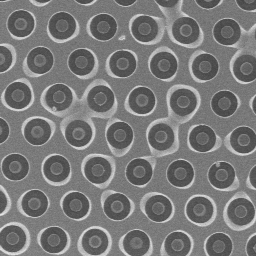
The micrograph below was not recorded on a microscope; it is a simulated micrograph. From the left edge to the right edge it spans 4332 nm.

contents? an array of small figures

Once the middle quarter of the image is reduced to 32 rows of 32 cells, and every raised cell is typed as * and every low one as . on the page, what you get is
*.......***.......***........**.
**......***.......***.......****
***....*****.....*****......****
***********************....*****
********************************
.******....******************.**
..****......*****.....*****.....
...**.......****......****......
...**........***.......***......
...**........**........***......
...*.........***.......***......
..***.......****......****......
***.***....*******...******.....
*.....*********************....*
......******...********....*****
.......****.....******......****
.......****......****.......****
........**.......****.......***.
.......****......****.......***.
*......****......****.......***.
**....*****......****.......***.
************....******.....*****
************************.*******
******.....*******..************
.****.......*****.....*****....*
.****.......****......****......
..***.......***.......****......
..***.......***.......****......
.*****......****......****......
*******....*****.....*****......
******************..********...*
********************************